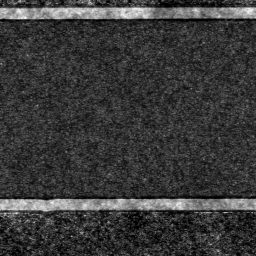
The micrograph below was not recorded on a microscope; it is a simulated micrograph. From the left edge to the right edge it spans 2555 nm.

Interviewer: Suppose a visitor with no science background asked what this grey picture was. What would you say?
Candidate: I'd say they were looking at one or a few lines or trenches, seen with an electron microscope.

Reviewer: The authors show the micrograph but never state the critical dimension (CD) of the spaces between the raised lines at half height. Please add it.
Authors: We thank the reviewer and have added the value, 1.91 micrometres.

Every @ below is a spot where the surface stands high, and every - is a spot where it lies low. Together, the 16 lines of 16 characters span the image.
@@@@@@@@@@@@@@@@
----------------
----------------
----------------
----------------
----------------
----------------
----------------
----------------
----------------
----------------
----------------
----------------
@@@@@@@@@@@@@@@@
@@@@@@@@@@@@@@@@
@@@@@@@@@@@@@@@@